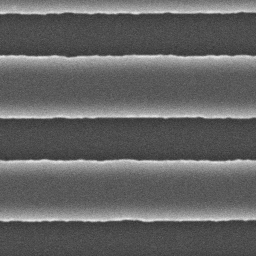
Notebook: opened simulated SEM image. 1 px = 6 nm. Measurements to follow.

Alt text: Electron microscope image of lines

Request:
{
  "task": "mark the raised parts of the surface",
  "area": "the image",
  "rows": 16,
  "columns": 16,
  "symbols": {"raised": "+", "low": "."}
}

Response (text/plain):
++++++++++++++++
................
................
..........+.....
++++++++++++++++
++++++++++++++++
++++++++++++++++
................
................
................
++++++++++++++++
++++++++++++++++
++++++++++++++++
++++++++++++++++
................
................